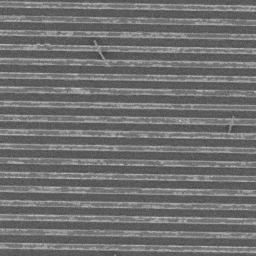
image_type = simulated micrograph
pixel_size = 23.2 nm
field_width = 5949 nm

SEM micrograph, parallel lines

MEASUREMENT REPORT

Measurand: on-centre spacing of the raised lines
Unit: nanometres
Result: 330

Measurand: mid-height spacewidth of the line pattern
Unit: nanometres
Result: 203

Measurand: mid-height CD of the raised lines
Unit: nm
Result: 113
